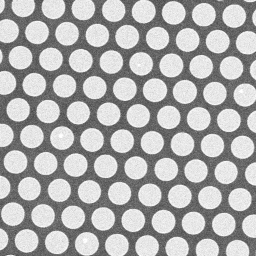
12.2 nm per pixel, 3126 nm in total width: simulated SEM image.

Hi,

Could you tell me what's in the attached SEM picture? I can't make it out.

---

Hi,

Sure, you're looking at an array of small figures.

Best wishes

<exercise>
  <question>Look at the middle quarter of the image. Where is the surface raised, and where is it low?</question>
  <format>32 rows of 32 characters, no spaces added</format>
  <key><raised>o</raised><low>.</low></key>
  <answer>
..ooooo..ooooo..oooooo..oooooo..
...ooo....oooo...ooooo..ooooo...
..................ooo....oooo...
oo....ooo.......................
ooo..ooooo...oooo....oooo....ooo
ooo..ooooo...ooooo..ooooo...oooo
ooo..oooooo.oooooo..oooooo.ooooo
oo...ooooo...ooooo..ooooo..ooooo
.......oo....oooo....oooo...oooo
.............................ooo
.ooooo...oooo....ooo............
.ooooo...ooooo..ooooo...oooo....
.ooooo..oooooo..ooooo..oooooo..o
.ooooo..oooooo..ooooo..oooooo..o
..ooo....oooo...ooooo...ooooo..o
.................ooo....oooo...o
oo....oo........................
oo...oooo...ooooo...oooo....ooo.
oo..oooooo..ooooo..oooooo..ooooo
oo..oooooo..ooooo..oooooo..ooooo
o....oooo...ooooo..oooooo..ooooo
......oo.....ooo....oooo...ooooo
............................ooo.
.oooo...oooo.....oo.............
oooooo..ooooo...oooo...ooooo...o
oooooo..ooooo..oooooo..ooooo...o
ooooo...ooooo..oooooo..ooooo..oo
.oooo...oooo....oooo...ooooo..oo
.................oo.....ooo....o
o....ooo........................
o...ooooo...oooo....ooo.....oo..
o...ooooo..oooooo..ooooo...oooo.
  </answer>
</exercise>